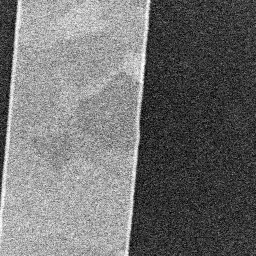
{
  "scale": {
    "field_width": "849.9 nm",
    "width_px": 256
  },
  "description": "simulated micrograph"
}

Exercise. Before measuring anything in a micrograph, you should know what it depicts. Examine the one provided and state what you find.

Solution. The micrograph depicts one or a few lines or trenches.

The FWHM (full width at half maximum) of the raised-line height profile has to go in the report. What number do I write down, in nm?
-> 429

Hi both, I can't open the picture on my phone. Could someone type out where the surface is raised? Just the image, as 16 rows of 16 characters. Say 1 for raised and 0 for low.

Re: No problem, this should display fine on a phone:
0111111110000000
0111111110000000
0111111110000000
0111111110000000
0111111110000000
0111111110000000
0111111110000000
0111111110000000
0111111110000000
1111111100000000
1111111100000000
1111111100000000
1111111100000000
1111111100000000
1111111100000000
1111111100000000